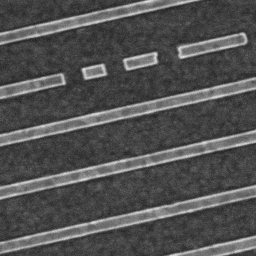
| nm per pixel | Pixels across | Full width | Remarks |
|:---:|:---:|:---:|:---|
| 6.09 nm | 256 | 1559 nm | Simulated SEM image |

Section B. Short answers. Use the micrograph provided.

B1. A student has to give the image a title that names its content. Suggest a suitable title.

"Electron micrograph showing parallel lines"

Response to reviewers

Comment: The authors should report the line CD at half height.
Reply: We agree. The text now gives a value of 60.3 nm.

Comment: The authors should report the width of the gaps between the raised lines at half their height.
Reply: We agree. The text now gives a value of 252 nm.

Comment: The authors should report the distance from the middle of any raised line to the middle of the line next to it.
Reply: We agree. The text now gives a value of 311 nm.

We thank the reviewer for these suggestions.